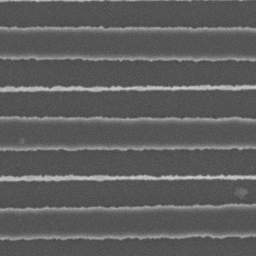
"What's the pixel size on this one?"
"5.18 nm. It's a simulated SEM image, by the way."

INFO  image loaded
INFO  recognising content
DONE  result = lines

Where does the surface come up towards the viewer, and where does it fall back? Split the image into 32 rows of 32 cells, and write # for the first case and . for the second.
................................
................................
................................
#############.##########.#.####.
################################
################################
################################
..................#.....#.#...##
................................
................................
................................
................................
................................
................................
................................
################################
################################
################################
################################
................................
................................
................................
...#........#...................
................................
................................
................................
################################
################################
################################
################################
................................
................................